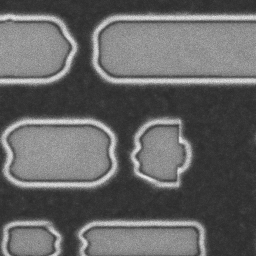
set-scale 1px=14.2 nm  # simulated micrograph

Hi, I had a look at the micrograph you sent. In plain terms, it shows one or a few lines or trenches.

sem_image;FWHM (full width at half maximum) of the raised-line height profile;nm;626